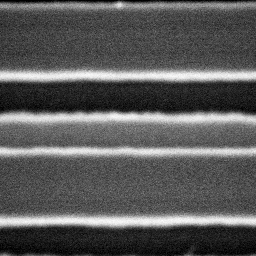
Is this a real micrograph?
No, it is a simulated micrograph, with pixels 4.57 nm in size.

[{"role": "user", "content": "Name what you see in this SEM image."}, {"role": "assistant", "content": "lines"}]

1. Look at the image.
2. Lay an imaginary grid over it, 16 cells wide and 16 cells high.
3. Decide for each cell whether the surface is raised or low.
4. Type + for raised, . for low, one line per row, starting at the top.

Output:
++++++++++++++++
++++++++++++++++
++++++++++++++++
++++++++++++++++
++++++++++++++++
................
................
................
................
++++++++++++++++
++++++++++++++++
++++++++++++++++
++++++++++++++++
++++++++++++++++
................
................